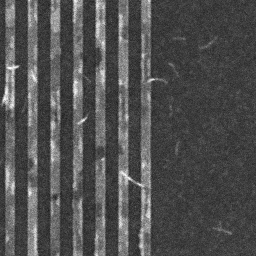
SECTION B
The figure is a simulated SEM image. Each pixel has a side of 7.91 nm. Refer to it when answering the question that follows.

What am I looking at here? parallel lines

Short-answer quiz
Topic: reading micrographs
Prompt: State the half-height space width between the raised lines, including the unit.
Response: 111 nanometers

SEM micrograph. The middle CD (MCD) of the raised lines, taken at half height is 70.2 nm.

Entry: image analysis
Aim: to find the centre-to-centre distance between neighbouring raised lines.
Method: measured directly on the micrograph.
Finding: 179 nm